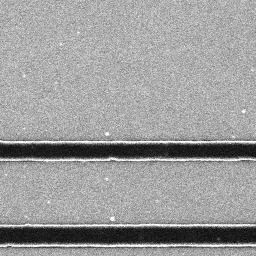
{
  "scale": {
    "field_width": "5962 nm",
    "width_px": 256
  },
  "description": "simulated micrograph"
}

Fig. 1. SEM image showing one or a few lines or trenches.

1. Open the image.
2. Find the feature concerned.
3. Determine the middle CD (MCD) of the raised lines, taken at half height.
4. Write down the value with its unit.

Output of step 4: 472 nanometres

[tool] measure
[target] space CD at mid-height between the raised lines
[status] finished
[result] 1480 nm